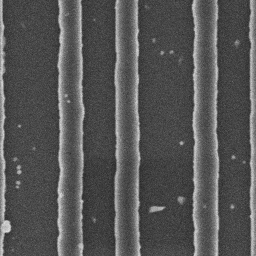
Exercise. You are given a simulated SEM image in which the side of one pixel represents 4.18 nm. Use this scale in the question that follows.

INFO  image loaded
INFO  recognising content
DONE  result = lines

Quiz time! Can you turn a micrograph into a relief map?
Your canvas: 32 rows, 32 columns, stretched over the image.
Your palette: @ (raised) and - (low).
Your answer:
-------@@@-----@@-------@@@----@
--------@@-----@@-------@@@----@
-------@@@-----@@-------@@@----@
--------@@-----@@-------@@@----@
--------@@-----@@-------@@@----@
--------@@-----@@-------@@@----@
-------@@@-----@@-------@@@----@
-------@@@-----@@-------@@@----@
-------@@@-----@@-------@@@----@
-------@@@----@@@-------@@@----@
-------@@@----@@@-------@@@----@
-------@@@-----@@-------@@@----@
@------@@@-----@@-------@@@----@
--------@@-----@@-------@@@----@
@-------@@-----@@-------@@@----@
--------@@-----@@-------@@@----@
--------@@-----@@-------@@@----@
--------@@-----@@-------@@@----@
--------@@-----@@-------@@@----@
-------@@@-----@@@------@@@----@
@------@@@-----@@-------@@@----@
@-------@@-----@@-------@@@----@
@------@@@----@@@-------@@@----@
@------@@@----@@@-------@@@----@
@------@@@----@@@-------@@@----@
@------@@@----@@@-------@@@----@
@------@@@----@@@-------@@@----@
@------@@@-----@@-------@@@----@
@------@@@----@@@-------@@@-----
-------@@@-----@@-------@@@----@
-------@@@-----@@-------@@@----@
-------@@@-----@@@------@@@----@